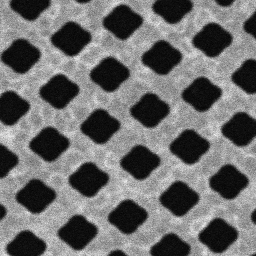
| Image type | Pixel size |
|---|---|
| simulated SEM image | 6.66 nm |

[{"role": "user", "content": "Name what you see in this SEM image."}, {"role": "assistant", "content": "a regular array of holes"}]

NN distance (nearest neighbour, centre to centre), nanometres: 350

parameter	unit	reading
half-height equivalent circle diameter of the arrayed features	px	34.7